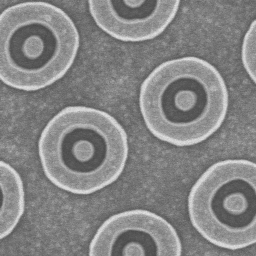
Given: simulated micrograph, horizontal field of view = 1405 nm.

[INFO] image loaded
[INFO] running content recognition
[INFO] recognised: ring-shaped raised bodies with a dot in the middle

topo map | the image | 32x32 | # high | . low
...###.....###..#...##..........
.#######...###.....###..........
#########...####.####...........
##....###....#######...........#
#......###....#####............#
#..##..###.....................#
#..##..##.....................##
#.....###.............###.....##
##...###............######.....#
#######............########....#
.#####............###....###....
..................##...#..##....
..................##..##..##....
..................##..##..##....
.......######.....##.....###....
......#########...#########.....
......##....###....#######......
.....###.....###.....####.......
.....###.###.###................
.....###.##..###................
.....###.....##............#####
##....###..####...........######
##.....#######...........####..#
###.....####............###.....
###.....................###..#..
###.....................##..###.
###.............##......###..#..
##............######....###.....
##...........#########...####..#
............###....###....######
............##..#...##.....####.
...........###..##..##..........